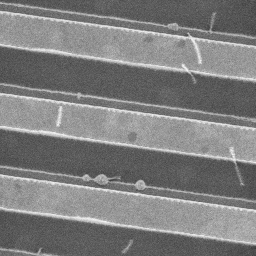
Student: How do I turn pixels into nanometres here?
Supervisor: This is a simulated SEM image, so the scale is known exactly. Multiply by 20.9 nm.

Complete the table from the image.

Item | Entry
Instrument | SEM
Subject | lines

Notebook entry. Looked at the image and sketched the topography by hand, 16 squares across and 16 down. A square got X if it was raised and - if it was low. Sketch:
----------------
XXXXXX----------
XXXXXXXXXXXXX---
-----XXXXXXXXXXX
------------XXXX
----------------
XXXXX-----------
XXXXXXXXXXXX----
----XXXXXXXXXXXX
-----------XXXXX
----------------
XXXX------------
XXXXXXXXXXX-----
---XXXXXXXXXXXXX
----------XXXXXX
----------------